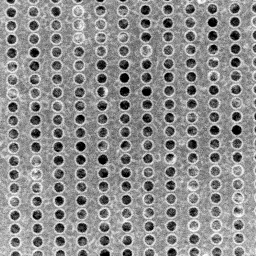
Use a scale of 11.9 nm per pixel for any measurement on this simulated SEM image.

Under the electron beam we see a regular array of holes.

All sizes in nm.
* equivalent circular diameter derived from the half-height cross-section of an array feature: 125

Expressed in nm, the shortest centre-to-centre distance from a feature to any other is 160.